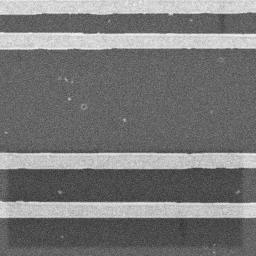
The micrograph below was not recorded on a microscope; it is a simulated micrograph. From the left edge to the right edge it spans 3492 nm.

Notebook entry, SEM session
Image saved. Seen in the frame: lines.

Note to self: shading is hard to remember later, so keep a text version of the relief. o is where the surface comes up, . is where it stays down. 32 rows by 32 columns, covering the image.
oooooooooooooooooooooooooooooooo
ooooooooooooooooooooooooooooooo.
................................
................................
oooooooooooooooooooooooooooooooo
oooooooooooooooooooooooooooooooo
................................
................................
................................
................................
................................
................................
................................
................................
................................
................................
................................
................................
................................
oooooooooooooooooooooooooooooooo
oooooooooooooooooooooooooooooooo
................................
................................
................................
................................
oooooooooooooooooooooooooooooooo
oooooooooooooooooooooooooooooooo
................................
................................
................................
................................
................................